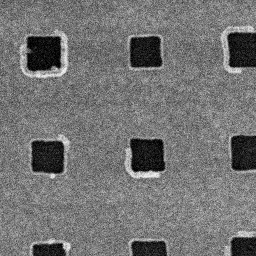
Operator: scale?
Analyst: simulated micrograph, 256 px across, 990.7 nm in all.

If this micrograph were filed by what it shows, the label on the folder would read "holes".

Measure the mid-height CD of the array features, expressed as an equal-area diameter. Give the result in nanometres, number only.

147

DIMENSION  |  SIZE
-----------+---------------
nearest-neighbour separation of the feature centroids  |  391 nm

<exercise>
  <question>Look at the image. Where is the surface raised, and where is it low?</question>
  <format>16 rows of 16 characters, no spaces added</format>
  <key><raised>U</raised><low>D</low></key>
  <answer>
UUUUUUUUUUUUUUUU
UUUUUUUUUUUUUUUU
UUDDUUUUDDUUUUDD
UUDDUUUUDDUUUUDD
UUUUUUUUUUUUUUUU
UUUUUUUUUUUUUUUU
UUUUUUUUUUUUUUUU
UUUUUUUUUUUUUUUU
UUUUUUUUUUUUUUUD
UUDDUUUUDDUUUUDD
UUDDUUUUDDUUUUUD
UUUUUUUUUUUUUUUU
UUUUUUUUUUUUUUUU
UUUUUUUUUUUUUUUU
UUUUUUUUUUUUUUUU
UUDDUUUUDDUUUUDD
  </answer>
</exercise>